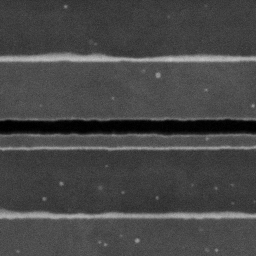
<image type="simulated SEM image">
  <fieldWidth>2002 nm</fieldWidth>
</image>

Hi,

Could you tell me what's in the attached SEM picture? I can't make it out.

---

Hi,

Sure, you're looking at lines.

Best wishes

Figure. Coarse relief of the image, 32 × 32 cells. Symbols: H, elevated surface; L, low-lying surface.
LLLLLLLLLLLLLLLLLLLLLLLLLLLLLLLL
LLLLLLLLLLLLLLLLLLLLLLLLLLLLLLLL
LLLLLLLLLLLLLLLLLLLLLLLLLLLLLLLL
LLLLLLLLLLLLLLLLLLLLLLLLLLLLLLLL
LLLLLLLLLLLLLLLLLLLLLLLLLLLLLLLL
LLLLLLLLLLLLLLLLLLLLLLLLLLLLLLLL
LLLLLLLLLLLLLLLLLLLLLLLLLLLLLLLL
HHHHHHHHHHHHHHHHLLLHHHHHHHHHHHHH
HHHHHHHHHHHHHHHHHHHHHHHHHHHHHHHH
HHHHHHHHHHHHHHHHHHHHHHHHHHHHHHHH
HHHHHHHHHHHHHHHHHHHHHHHHHHHHHHHH
HHHHHHHHHHHHHHHHHHHHHHHHHHHHHHHH
HHHHHHHHHHHHHHHHHHHHHHHHHHHHHHHH
HHHHHHHHHHHHHHHHHHHHHHHHHHHHHHHH
HHHHHHHHHHHHHHHHHHHHHHHHHHHHHHHH
LLLLLLLLLLLLLLLLLLLLLLLLLLLLLLLL
LLLLLLLLLLLLLLLLLLLLLLLLLLLLLLLL
HHHHHHHHHHHHHHHHHHHHHHHHHHHHHHHH
HHHHHLHHHLHLLHHHHHHHHHHHHLHHLLLL
LLLLLLLLLLLLLLLLLLLLLLLLLLLLLLLL
LLLLLLLLLLLLLLLLLLLLLLLLLLLLLLLL
LLLLLLLLLLLLLLLLLLLLLLLLLLLLLLLL
LLLLLLLLLLLLLLLLLLLLLLLLLLLLLLLL
LLLLLLLLLLLLLLLLLLLLLLLLLLLLLLLL
LLLLLLLLLLLLLLLLLLLLLLLLLLLLLLLL
LLLLLLLLLLLLLLLLLLLLLLLLLLLLLLLL
LLLLLLLLLLLLLLLLLLLLLLLLLLLLLLLL
HHHHHHHHHHHHHHHHHHHHHHHHHHHHHHHH
HHHHHHHHHHHHHHHHHHHHHHHHHHHHHHHH
HHHHHHHHHHHHHHHHHHHHHHHHHHHHHHHH
HHHHHHHHHHHHHHHHHHHHHHHHHHHHHHHH
HHHHHHHHHHHHHHHHHHHHHHHHHHHHHHHH